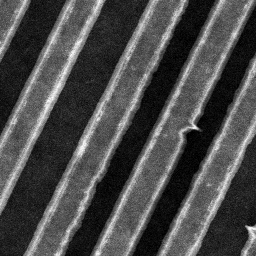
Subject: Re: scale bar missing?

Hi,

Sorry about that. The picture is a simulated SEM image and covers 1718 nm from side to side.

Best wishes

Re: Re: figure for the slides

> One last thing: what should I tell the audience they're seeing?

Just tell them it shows one or a few lines or trenches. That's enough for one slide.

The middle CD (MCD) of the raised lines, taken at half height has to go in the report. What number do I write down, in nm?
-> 210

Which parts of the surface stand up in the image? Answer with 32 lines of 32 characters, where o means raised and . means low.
ooo.....ooooo......oooo....ooooo
ooo.....oooo......ooooo....oooo.
oo.....ooooo......oooo....ooooo.
oo.....oooo......ooooo....oooo..
o.....ooooo......oooo....ooooo..
o.....oooo......ooooo....oooo...
.....ooooo......oooo....ooooo...
.....oooo......ooooo....oooo....
.....oooo......oooo....ooooo...o
....oooo......ooooo....oooo....o
....oooo......oooo....ooooo...oo
...oooo......ooooo....oooo....oo
...oooo......oooo....ooooo...ooo
..oooo......ooooo....oooo....ooo
..oooo......oooo....ooooo....ooo
.oooo......ooooo....oooo....oooo
.oooo......oooo....oooo.....oooo
oooo......ooooo....oooo....oooo.
oooo......oooo....ooooo...ooooo.
ooo......ooooo....oooo....oooo..
ooo......oooo....ooooo...ooooo..
oo......ooooo....oooo....oooo...
oo......oooo....ooooo...ooooo...
o......ooooo....oooo....oooo....
o......oooo....ooooo....oooo....
.......oooo....oooo....oooo.....
......oooo....ooooo...ooooo.....
......oooo....oooo....oooo......
.....oooo....ooooo....oooo.....o
.....oooo....oooo....oooo......o
....oooo....ooooo....oooo......o
....oooo....oooo....oooo.......o